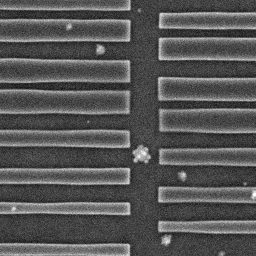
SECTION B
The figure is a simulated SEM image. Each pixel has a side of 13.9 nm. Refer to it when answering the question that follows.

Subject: groups of lines, slits or small figures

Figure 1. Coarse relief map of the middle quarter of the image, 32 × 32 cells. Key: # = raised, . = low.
################................
################................
################................
################........####....
........................########
........................########
........................########
################........########
################........########
################................
################................
################................
........................########
........................########
........................########
........................########
........................########
################................
################................
################................
....############................
..................###...########
..................###...########
..................###...########
........................########
................................
################................
################.............#..
################................
################................
................................
........................########